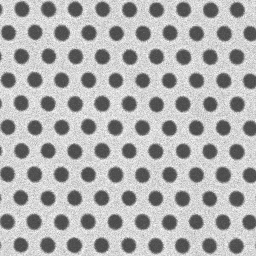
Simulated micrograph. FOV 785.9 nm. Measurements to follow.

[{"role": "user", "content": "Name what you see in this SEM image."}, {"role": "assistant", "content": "a regular array of holes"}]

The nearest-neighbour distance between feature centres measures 81.6 nm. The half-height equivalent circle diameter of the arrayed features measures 45 nm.